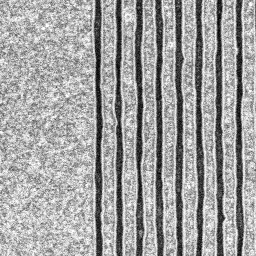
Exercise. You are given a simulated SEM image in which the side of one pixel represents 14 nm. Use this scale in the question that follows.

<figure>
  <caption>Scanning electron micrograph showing parallel lines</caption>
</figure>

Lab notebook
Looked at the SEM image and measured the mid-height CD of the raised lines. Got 185 nm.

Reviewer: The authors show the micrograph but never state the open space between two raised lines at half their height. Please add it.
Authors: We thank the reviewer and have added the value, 105 nm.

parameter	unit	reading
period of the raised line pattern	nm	280